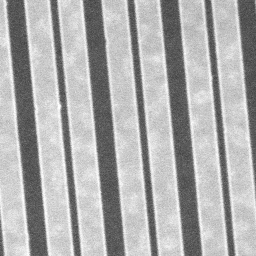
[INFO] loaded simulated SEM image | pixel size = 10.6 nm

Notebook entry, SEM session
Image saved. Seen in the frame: parallel lines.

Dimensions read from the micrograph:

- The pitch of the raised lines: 398 nm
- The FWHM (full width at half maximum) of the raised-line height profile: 255 nm